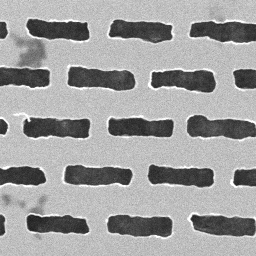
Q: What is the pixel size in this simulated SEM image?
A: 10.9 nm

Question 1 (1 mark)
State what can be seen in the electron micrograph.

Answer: a regular array of holes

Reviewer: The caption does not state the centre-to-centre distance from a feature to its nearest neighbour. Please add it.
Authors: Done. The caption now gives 689 nm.